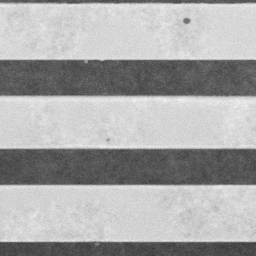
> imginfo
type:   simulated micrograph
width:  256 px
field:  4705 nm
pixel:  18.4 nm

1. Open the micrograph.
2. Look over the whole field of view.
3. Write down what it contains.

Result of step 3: lines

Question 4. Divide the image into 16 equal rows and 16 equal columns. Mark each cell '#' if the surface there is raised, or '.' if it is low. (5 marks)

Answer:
################
################
################
################
................
................
################
################
################
................
................
................
################
################
################
................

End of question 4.